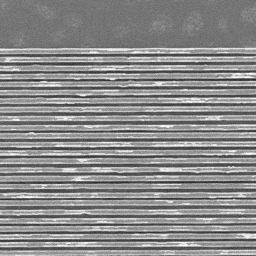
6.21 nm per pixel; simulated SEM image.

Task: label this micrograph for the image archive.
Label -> parallel lines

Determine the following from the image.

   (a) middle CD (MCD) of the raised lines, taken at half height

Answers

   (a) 0.0311 micrometres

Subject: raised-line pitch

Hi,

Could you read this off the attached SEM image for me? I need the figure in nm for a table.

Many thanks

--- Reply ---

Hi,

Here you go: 52.2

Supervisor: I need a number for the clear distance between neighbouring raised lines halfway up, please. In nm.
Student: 21